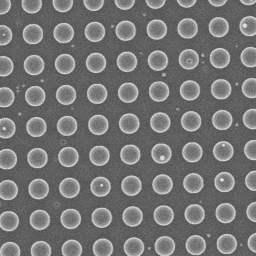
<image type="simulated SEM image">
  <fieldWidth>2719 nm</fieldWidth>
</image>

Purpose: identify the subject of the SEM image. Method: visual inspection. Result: an array of small figures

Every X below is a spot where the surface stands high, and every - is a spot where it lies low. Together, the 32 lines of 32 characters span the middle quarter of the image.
XXX---XXXX----XXXX---XXXXX---XXX
XX----XXXX----XXX------X--------
--------------------------------
--------------------------------
------------------------X-----XX
XX-----XXX----XXXX----XXXX---XXX
XXX---XXXXX---XXXX---XXXXX---XXX
XXX---XXXXX---XXXXX--XXXXX---XXX
XXX---XXXXX---XXXX----XXXX----XX
XX-----XXX-----XX---------------
--------------------------------
--------------------------------
---------------XX------XX-----XX
XX-----XXX----XXXX----XXXX---XXX
XXX---XXXXX---XXXXX---XXXX---XXX
XXX---XXXXX---XXXXX---XXXX----XX
XXX---XXXXX---XXXX----XXXX-----X
XX------X-----------------------
--------------------------------
--------------------------------
---------------XXX-----XXX----XX
XXX----XXXX---XXXXX---XXXXX---XX
XXXX--XXXXX---XXXXX---XXXXX---XX
XXXX--XXXXX---XXXXX---XXXXX---XX
XXX----XXXX----XXX-----XXX------
XX------------------------------
--------------------------------
--------------------------------
--------XX-----XXX-----XXX----XX
XXX----XXXX----XXXX---XXXXX---XX
XXXX---XXXXX--XXXXX---XXXXX---XX
XXXX---XXXX----XXXX----XXXX----X